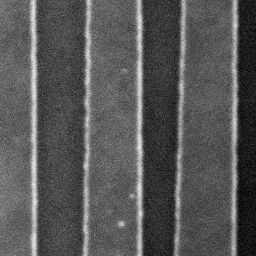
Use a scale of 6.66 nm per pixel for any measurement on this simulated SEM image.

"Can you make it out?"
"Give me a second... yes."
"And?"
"lines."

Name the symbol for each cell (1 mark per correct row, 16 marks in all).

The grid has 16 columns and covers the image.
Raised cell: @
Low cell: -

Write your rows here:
@@---@@@@--@@@@-
@@---@@@@--@@@@-
@@---@@@@--@@@@-
@@---@@@@--@@@@-
@@---@@@@--@@@@-
@@---@@@@--@@@@-
@@---@@@@--@@@@-
@@---@@@@--@@@@-
@@---@@@@--@@@@-
@@---@@@@--@@@@-
@@---@@@@--@@@@-
@@---@@@@--@@@@-
@@---@@@@--@@@@-
@@---@@@@--@@@@-
@@---@@@@--@@@@-
@@---@@@@--@@@@-